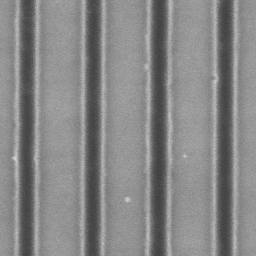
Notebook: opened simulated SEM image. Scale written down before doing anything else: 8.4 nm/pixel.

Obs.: one or a few lines or trenches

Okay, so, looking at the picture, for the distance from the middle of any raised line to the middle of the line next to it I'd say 554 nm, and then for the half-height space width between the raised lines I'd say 358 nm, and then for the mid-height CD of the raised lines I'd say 0.194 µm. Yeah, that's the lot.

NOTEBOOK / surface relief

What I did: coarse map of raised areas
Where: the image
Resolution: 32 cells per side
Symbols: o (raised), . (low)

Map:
..ooo.....ooo......oo......ooo..
..ooo.....ooo......oo......ooo..
..ooo.....ooo......oo......ooo..
..ooo.....ooo......oo......ooo..
..ooo.....ooo.....ooo......ooo..
..ooo.....ooo.....ooo......oo...
..ooo.....ooo.....ooo......oo...
..ooo.....ooo.....ooo......ooo..
..ooo.....ooo.....ooo......oo...
..ooo.....ooo.....ooo......oo...
..ooo.....ooo.....ooo......oo...
..ooo.....ooo.....ooo......oo...
..ooo.....ooo.....ooo......oo...
..ooo.....ooo.....ooo......oo...
..ooo.....ooo.....ooo......oo...
..ooo.....ooo.....ooo......oo...
..ooo.....ooo.....ooo......oo...
..ooo.....ooo.....ooo......ooo..
..ooo.....ooo.....ooo......ooo..
..ooo.....ooo.....ooo......ooo..
..ooo.....ooo.....ooo......ooo..
..ooo.....ooo.....ooo......ooo..
..ooo.....ooo.....ooo......ooo..
..ooo.....ooo.....ooo......ooo..
..ooo.....ooo.....ooo......ooo..
..ooo.....ooo.....ooo......ooo..
..ooo.....ooo.....ooo......oo...
..ooo.....ooo.....ooo......oo...
..ooo.....ooo.....ooo......oo...
..ooo.....ooo.....ooo......oo...
..ooo.....ooo.....ooo......oo...
..ooo.....ooo.....ooo......oo...